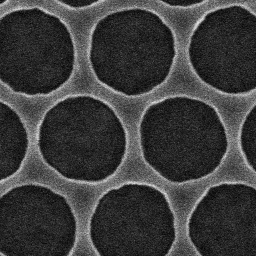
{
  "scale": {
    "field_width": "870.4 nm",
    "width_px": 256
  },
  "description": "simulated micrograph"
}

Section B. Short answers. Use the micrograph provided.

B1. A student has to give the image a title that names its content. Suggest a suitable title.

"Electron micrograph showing holes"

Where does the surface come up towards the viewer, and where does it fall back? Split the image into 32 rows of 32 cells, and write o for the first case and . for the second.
oooooooo...oooooooooo....ooooooo
o....oooooooooo....ooooooo.....o
.......oooooo.......ooooo.......
........oooo.........oooo.......
.........ooo..........oo........
.........oo...........oo........
.........oo...........o.........
.........oo...........oo........
.........ooo.........ooo........
.........ooo.........oooo.......
o.......ooooo.......oooooo......
oo....ooooooooo...oooooooooo...o
oooooooo....ooooooooo....ooooooo
.ooooo........ooooo........ooooo
..oooo.........ooo.........oooo.
...oo..........ooo..........oo..
...oo...........o...........oo..
...oo...........oo..........oo..
...oo...........oo..........oo..
...oo...........oo..........ooo.
...ooo.........oooo........oooo.
..ooooo.......oooooo.......ooooo
ooooooooo....oooooooo...oooooooo
oo....ooooooooo....ooooooo......
........ooooo........ooooo......
.........ooo.........oooo.......
.........ooo..........oo........
.........oo...........oo........
..........o...........oo........
.........oo...........oo........
.........ooo..........oo........
.........ooo.........oooo.......